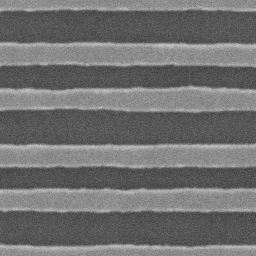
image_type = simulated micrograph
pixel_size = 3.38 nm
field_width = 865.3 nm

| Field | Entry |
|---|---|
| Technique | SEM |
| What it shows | lines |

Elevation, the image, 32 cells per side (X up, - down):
XXXXXXXXXXXXXXXXXXXXXXXXXXXXXXXX
--------------------------------
--------------------------------
--------------------------------
--------------------------------
---------XXXX-------------------
XXXXXXXXXXXXXXXXXXXXXXXXXXXXXXXX
XXXXXXXXXXXXXXXXXXXXXXXXXXXXXXXX
--------------------------------
--------------------------------
--------------------------------
XXXXXXXXXXXXXXXXXXXXXXXXXXXXXXXX
XXXXXXXXXXXXXXXXXXXXXXXXXXXXXXXX
XXXXXXX---XX-XXXXXXXXXXXXXXXXXXX
--------------------------------
--------------------------------
--------------------------------
--------------------------------
XXXXXXXXXXXXXXXXXXXXXXXXXXXXXXXX
XXXXXXXXXXXXXXXXXXXXXXXXXXXXXXXX
XXXXXXXXXXXXXXXXXXXXXXXXXXXXXXXX
--------------------------------
--------------------------------
--------------------------------
XXXXXXXXXXXXXXXXXXXXXXXXXXXXXXXX
XXXXXXXXXXXXXXXXXXXXXXXXXXXXXXXX
--------------------------------
--------------------------------
--------------------------------
--------------------------------
--------------------------------
XXXXXXXXXXXXXXXXXXXXXXXXXXXXXXXX